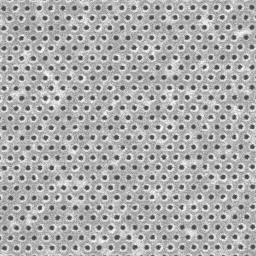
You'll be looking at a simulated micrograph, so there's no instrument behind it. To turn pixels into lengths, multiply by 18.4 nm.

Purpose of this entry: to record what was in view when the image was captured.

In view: a regular array of holes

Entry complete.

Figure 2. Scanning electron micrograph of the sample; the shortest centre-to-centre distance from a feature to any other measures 11.2 px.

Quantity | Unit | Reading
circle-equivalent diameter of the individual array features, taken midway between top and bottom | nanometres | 99.6